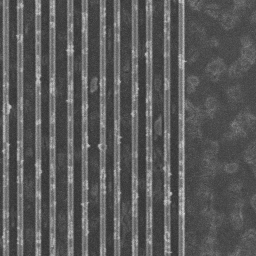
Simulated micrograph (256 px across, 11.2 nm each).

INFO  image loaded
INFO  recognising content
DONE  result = parallel lines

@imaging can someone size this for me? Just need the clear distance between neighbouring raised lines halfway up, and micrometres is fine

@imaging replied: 0.112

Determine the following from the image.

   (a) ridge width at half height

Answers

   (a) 55.8 nm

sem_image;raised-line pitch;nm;178